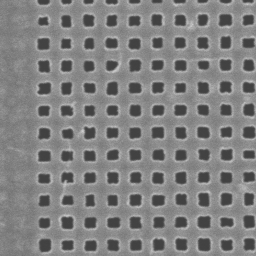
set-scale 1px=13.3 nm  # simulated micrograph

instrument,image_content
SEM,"a regular array of holes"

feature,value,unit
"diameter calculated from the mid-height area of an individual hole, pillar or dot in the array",170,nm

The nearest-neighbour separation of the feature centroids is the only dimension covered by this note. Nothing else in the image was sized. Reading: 295 nm